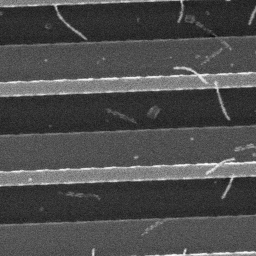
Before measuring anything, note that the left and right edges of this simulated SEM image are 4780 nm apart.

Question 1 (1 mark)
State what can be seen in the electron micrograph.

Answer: lines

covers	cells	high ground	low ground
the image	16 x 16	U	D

DDDDDDDDDDDDDDDD
DDDDDDDDDDDDDDDD
DDDDDDDDDDUUUUUU
UUUUUUUUUUUUUUUU
UUUUUUUUUUUUUUUU
UUUUUUUUUUUUUUDD
DDDDDDDDDDDDDDDD
DDDDDDDDDDDDDDDD
UUUUUUUUUUUUUUUU
UUUUUUUUUUUUUUUU
UUUUUUUUUUUUUUUU
UUUUDDDDDDDDDDDD
DDDDDDDDDDDDDDDD
DDDDDDDDDDDDDDDU
UUUUUUUUUUUUUUUU
UUUUUUUUUUUUUUUU